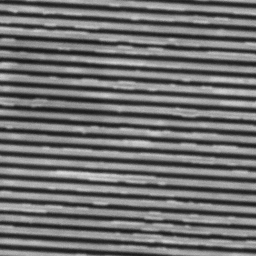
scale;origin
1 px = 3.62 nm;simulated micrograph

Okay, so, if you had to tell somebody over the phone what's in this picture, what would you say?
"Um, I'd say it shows parallel lines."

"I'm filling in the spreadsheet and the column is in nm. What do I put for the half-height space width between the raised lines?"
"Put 20.8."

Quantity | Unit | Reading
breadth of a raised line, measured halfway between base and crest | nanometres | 20.8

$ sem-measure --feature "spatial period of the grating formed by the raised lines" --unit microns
0.0422